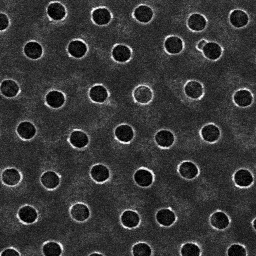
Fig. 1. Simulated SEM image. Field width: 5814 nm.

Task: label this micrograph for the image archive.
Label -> a regular array of holes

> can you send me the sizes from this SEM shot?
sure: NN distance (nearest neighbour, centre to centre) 943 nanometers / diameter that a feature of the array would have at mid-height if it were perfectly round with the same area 411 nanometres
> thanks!